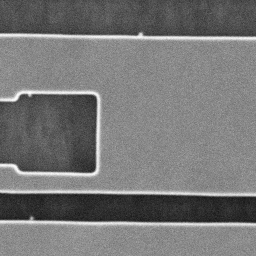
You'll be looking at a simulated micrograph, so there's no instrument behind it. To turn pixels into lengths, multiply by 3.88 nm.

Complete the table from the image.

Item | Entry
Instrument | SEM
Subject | groups of lines, slits or small figures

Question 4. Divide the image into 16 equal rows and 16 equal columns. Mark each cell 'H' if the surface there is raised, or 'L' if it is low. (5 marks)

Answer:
LLLLLLLLLLLLLLLL
LLLLLLLLLLLLLLLL
HHHHHHHHHHHHHHHH
HHHHHHHHHHHHHHHH
HHHHHHHHHHHHHHHH
HHHHHHHHHHHHHHHH
LLLLLLHHHHHHHHHH
LLLLLLHHHHHHHHHH
LLLLLLHHHHHHHHHH
LLLLLLHHHHHHHHHH
HLLLLLHHHHHHHHHH
HHHHHHHHHHHHHHHH
LLLLLLLLLLLLLLLL
LLLLLLLLLLLLLLLL
HHHHHHHHHHHHHHHH
HHHHHHHHHHHHHHHH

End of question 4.